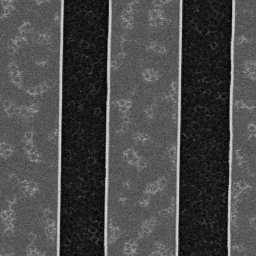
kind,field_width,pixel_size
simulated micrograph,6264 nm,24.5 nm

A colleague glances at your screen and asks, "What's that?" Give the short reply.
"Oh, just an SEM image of one or a few lines or trenches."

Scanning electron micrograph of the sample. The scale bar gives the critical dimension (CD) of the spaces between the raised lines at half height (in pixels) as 49.4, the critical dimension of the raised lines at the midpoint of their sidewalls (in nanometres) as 1750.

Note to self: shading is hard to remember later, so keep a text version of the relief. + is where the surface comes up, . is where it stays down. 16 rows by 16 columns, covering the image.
++++...++++....+
++++...++++....+
++++...++++....+
++++...++++....+
++++...++++....+
++++...++++....+
++++...++++...++
++++...++++...++
++++...++++...++
++++...++++...++
++++...++++...++
++++...++++...++
++++...++++...++
++++...++++...++
++++...++++...++
++++...++++...++